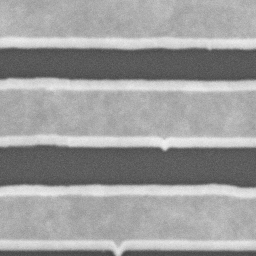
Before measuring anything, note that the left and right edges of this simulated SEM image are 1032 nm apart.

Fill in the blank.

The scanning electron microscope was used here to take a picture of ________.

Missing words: one or a few lines or trenches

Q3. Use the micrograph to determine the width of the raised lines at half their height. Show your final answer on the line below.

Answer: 0.234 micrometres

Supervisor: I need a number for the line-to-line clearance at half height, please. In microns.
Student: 0.169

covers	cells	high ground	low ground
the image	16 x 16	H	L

HHHHHHHHHHHHHHHH
HHHHHHHHHHHHHHHH
HHHHHHHHHHHHHHHH
LLLLLLLLLLLLLLLL
LLLLLLLLLLLLLLLL
HHHHHHHHHHHHHHHH
HHHHHHHHHHHHHHHH
HHHHHHHHHHHHHHHH
HHHHHHHHHHHHHHHH
LLLLLLLLLLLLLLLL
LLLLLLLLLLLLLLLL
LLLLLLLLLLLLLLLL
HHHHHHHHHHHHHHHH
HHHHHHHHHHHHHHHH
HHHHHHHHHHHHHHHH
LLLLLLLHLLLLLLLL